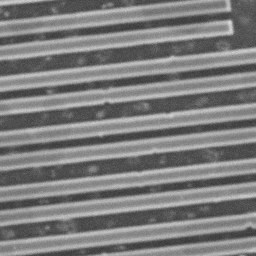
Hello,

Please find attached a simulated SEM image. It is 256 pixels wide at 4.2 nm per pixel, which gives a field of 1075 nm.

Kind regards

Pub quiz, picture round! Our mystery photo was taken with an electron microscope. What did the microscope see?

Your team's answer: parallel lines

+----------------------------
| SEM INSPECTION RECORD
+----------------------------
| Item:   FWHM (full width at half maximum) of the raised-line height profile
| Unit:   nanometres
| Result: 45.3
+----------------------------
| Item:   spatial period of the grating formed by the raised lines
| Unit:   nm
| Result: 115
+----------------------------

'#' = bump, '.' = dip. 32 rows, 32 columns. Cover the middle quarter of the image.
.............###################
....#########################...
####################............
#########.#.....................
##............................##
.....................###########
............####################
...#########################....
###################.............
##########......................
#...............................
................................
.............................###
....................############
...........#####################
..#########################.....
################................
##########......................
............................####
...................#############
..........######################
..########################......
#################...............
#######.........................
................................
................................
...........................#####
...................#############
..........######################
.######################.........
###############.................
######..........................